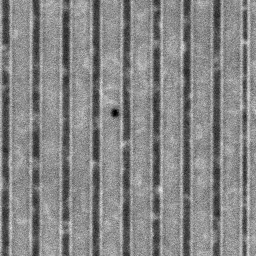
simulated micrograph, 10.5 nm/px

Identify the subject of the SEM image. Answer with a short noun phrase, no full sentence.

parallel lines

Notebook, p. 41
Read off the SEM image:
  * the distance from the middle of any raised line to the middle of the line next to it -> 29.8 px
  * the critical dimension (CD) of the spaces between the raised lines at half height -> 204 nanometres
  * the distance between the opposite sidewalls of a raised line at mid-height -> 111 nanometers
